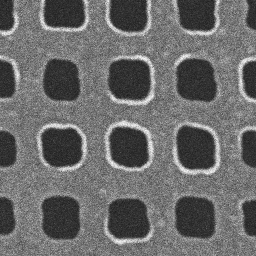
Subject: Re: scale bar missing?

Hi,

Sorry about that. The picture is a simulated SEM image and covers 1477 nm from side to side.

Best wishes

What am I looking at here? a regular array of holes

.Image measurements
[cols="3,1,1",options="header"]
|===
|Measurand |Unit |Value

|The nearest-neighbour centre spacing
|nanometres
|384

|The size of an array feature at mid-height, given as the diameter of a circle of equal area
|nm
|251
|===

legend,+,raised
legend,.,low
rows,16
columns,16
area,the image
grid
.++..++..++..++.
.++..++..++..+++
++++++++++++++++
++++++++++++++++
.++..++..++..++.
.++..++..++...+.
++++++++++++++++
++++++++++++++++
.++..++..++..++.
.++..++..++..++.
++++++++++++.+++
++++++++++++++++
.++..++..++..+++
.++..++..++..++.
.++..++..++..++.
++++++++++++++++